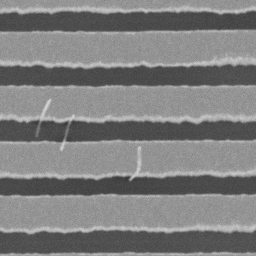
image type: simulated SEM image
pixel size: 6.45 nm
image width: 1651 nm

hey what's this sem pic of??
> lines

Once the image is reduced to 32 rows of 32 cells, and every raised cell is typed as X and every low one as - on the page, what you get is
XXXXXXXXXXXXXXXXXXXXXXXXXXXXXXXX
X-XX--X-----XXXX-----------XXXX-
--------------------------------
--------------------------------
XXXXXXXXXXXXXXXXXXXXXXXXXXXXXXXX
XXXXXXXXXXXXXXXXXXXXXXXXXXXXXXXX
XXXXXXXXXXXXXXXXXXXXXXXXXXXXXXXX
XXXXXXXXXXXXXXXXXXXXXXXXXXXXXXXX
----------X---------------------
--------------------------------
--------------------------------
XXXXXXXXXXXXXXXXXXXXXXXXXXXXXXXX
XXXXXXXXXXXXXXXXXXXXXXXXXXXXXXXX
XXXXXXXXXXXXXXXXXXXXXXXXXXXXXXXX
XXXXXXXXXXXXXXXXXXXXXXXXXXXXXXXX
--------------------------------
--------------------------------
--------------------------------
XXXXXXXXXXXXXXXXXXXXXXXXXXXXXXXX
XXXXXXXXXXXXXXXXXXXXXXXXXXXXXXXX
XXXXXXXXXXXXXXXXXXXXXXXXXXXXXXXX
XXXXXXXXXXXXXXXXXXXXXXXXXXXXXXXX
--------------------------------
--------------------------------
XXX--X-XXXXXXXXXXXXXXXXXXXXXXXXX
XXXXXXXXXXXXXXXXXXXXXXXXXXXXXXXX
XXXXXXXXXXXXXXXXXXXXXXXXXXXXXXXX
XXXXXXXXXXXXXXXXXXXXXXXXXXXXXXXX
XXXXXXXXXXXXXXXXXXXXXXXXXXXXXXXX
--------------------------------
--------------------------------
--------------------------------